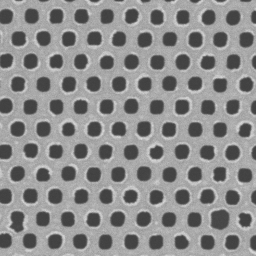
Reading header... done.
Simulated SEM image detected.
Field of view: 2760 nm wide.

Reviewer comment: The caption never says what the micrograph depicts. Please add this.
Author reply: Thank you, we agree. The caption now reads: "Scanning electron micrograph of a regular array of holes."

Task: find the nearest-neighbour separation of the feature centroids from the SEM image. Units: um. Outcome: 0.267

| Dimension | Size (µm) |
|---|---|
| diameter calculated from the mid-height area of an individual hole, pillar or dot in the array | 0.163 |